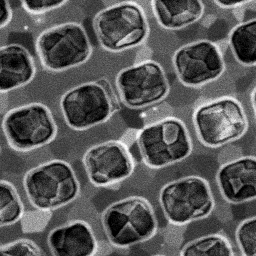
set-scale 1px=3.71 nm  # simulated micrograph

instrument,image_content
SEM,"a regular array of holes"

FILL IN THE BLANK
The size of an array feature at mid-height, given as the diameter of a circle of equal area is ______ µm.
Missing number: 0.176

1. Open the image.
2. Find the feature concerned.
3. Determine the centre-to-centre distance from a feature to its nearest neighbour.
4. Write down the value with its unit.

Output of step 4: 224 nm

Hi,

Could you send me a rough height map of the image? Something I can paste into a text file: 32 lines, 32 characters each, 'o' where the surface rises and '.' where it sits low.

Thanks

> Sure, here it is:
.oo....oooooooooooo......ooo..oo
.oooooooooooo.....o......ooooooo
.ooooooooooo......oo....oooooooo
ooooooo...oo......oooooooooooo..
ooooo......o......ooooooooooo...
ooooo......oo....ooooooo...oo...
...oo......ooooooooooo.....oo...
....o......ooooooooooo......oo..
....oo..oooooooo....oo......oooo
....ooooooooooo.....oo.....ooooo
...oooooooo.ooo......oo..ooooooo
ooooooooo....oo......ooooooooooo
oooooooo......oo....ooooooo..ooo
ooo..ooo......ooooooooooo.....oo
o.....oo.....ooooooooooo......oo
o......oo...ooooooo....oo......o
o......ooooooooooo.....oo.....oo
o.....ooooooooooo......oo....ooo
oo..oooooooo....oo......oooooooo
ooooooooooo.....oo.....ooooooooo
oooooo..ooo.....ooo..oooooooo...
oooo.....oo.....ooooooooooo.....
ooo......ooo...oooooooo..oo.....
..o.......ooooooooooo.....oo....
..oo.....ooooooooooo......oo....
..oo....ooooooo...oo.......ooooo
...oooooooooo......oo.....oooooo
..ooooooooooo......oo...ooooooo.
oooooooo...oo......ooooooooooo..
oooooo......oo.....ooooooooooo..
oo..oo......oo..oooooooo....oo..
.....oo.....ooooooooooo......o..